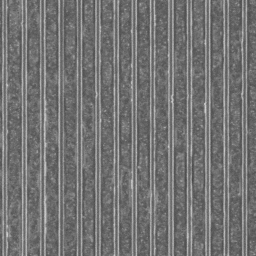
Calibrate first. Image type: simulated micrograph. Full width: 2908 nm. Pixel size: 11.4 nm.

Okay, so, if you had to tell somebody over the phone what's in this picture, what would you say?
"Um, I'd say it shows parallel lines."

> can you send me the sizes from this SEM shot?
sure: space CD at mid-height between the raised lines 158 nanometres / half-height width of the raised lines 4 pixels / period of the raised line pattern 209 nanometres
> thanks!